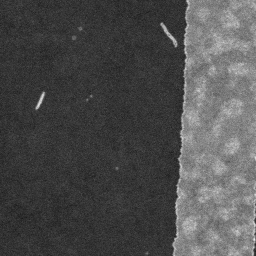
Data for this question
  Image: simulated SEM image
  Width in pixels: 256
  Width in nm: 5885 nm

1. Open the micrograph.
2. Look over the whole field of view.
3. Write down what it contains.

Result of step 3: one or a few lines or trenches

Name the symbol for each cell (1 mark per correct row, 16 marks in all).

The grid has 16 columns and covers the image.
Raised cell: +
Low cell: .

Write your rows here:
............++++
............++++
............++++
............++++
............++++
............++++
...........+++++
...........+++++
...........+++++
...........+++++
...........+++++
...........+++++
...........+++++
...........+++++
...........+++++
...........+++++